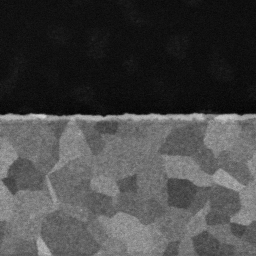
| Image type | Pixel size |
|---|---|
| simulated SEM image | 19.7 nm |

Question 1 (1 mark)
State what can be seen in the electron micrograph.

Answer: one or a few lines or trenches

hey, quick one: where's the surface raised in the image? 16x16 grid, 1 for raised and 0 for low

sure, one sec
0000000000000000
0000000000000000
0000000000000000
0000000000000000
0000000000000000
0000000000000000
0000000000000000
1111111111111111
1111111111111111
1111111111111111
1111111111111111
1111111111111111
1111111111111111
1111111111111111
1111111111111111
1111111111111111